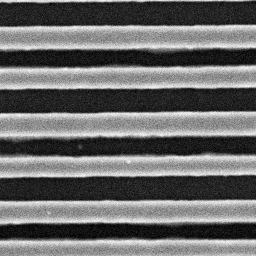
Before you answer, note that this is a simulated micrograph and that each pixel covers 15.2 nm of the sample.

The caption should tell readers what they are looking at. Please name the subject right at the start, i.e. lines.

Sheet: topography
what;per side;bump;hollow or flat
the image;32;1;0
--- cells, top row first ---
00000000000000000000000000000000
00000000000000000000000000000000
00000000000000000000000000000000
11111111111111111111111111111111
11111111111111111111111111111111
11111111111111111111111111111111
00000000000000000000000000000000
00000000000000000000000000000000
00000000000000000101011001111111
11111111111111111111111111111111
11111111111111111111111111111111
00000000000000000000000000000000
00000000000000000000000000000000
00000000000000000000000000000000
11111111111111111111111111111111
11111111111111111111111111111111
11111111111111111111111111111111
00000000000000000000000000000000
00000000000000000000000000000000
00000000000000000000000000000000
11111111111111111111111111111111
11111111111111111111111111111111
00000000000000000000000000000000
00000000000000000000000000000000
00000000000000000000000000000000
11111111111111111111111111111111
11111111111111111111111111111111
11111111111111111111111111111111
00000000000000000000000000000000
00000000000000000000000000000000
11111111111111111111111111111111
11111111111111111111111111111111